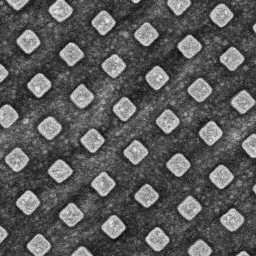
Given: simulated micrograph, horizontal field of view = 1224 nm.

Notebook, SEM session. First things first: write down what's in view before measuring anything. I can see a regular array of raised bodies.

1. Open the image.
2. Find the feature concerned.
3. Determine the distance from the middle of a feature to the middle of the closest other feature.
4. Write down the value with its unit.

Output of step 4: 212 nanometers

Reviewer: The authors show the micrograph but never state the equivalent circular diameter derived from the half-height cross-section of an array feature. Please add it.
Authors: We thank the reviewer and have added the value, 101 nanometers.